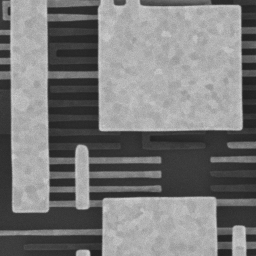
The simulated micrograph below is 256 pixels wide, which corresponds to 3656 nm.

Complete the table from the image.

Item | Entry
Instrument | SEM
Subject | wiring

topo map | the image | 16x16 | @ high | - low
-@@---@@@@@@@@@-
-@@---@@@@@@@@@-
-@@---@@@@@@@@@-
-@@---@@@@@@@@@-
-@@---@@@@@@@@@-
-@@---@@@@@@@@@-
-@@---@@@@@@@@@-
-@@---@@@@@@@@@-
-@@-------------
-@@-------------
-@@--@----------
-@@--@----------
-@@--@-@@@@@@---
------@@@@@@@@--
------@@@@@@@@--
------@@@@@@@@--